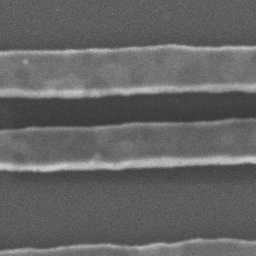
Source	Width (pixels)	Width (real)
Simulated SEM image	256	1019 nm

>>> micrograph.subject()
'lines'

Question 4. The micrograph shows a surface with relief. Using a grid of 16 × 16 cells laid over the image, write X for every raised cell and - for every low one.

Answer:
----------------
----------------
----------------
XXXXXXXXXXXXXXXX
XXXXXXXXXXXXXXXX
XXXXXXXXXXXXXXXX
----------------
--------------XX
XXXXXXXXXXXXXXXX
XXXXXXXXXXXXXXXX
-XXX------------
----------------
----------------
----------------
----------------
----XXXXXXXXXXXX